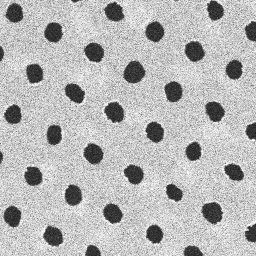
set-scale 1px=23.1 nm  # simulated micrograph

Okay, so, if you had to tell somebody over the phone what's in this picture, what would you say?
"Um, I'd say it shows a regular array of holes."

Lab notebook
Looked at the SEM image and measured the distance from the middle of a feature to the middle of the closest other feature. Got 1010 nanometers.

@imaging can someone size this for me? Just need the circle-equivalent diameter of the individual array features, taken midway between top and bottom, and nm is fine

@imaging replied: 453